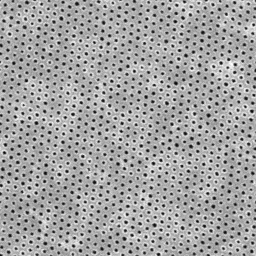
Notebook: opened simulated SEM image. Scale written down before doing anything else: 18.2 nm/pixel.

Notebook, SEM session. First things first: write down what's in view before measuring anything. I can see a regular array of holes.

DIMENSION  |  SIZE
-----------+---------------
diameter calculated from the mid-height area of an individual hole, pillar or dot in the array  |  0.065 µm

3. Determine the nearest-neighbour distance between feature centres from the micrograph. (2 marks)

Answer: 144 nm